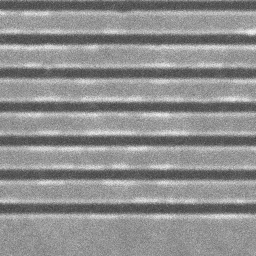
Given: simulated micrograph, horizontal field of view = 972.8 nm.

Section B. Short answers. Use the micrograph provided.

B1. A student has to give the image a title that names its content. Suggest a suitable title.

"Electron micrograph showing parallel lines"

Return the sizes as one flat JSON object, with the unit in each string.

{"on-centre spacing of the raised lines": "129 nanometers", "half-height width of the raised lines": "81.3 nanometres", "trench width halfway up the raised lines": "12.5 px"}